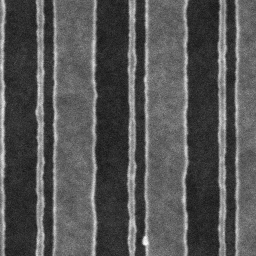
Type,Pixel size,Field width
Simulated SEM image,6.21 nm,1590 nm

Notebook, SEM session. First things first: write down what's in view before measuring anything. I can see lines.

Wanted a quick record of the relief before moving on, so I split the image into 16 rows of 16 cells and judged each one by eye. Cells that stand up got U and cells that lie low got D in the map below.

DDUUUUDDUUUUDDUU
DDUUUUDDUUUUDDUU
DDUUUUDDUUUUDDUU
DDUUUUDDUUUUDDUU
DDUUUUDDUUUUDDUU
DDUUUUDDUUUUDDUU
DDUUUUDDUUUUDDUU
DDUUUUDDUUUUDDUU
DDUUUUDDUUUUDDUU
DDUUUUDDUUUUDDUU
DDUUUUDDUUUUDDUU
DDUUUUDDUUUUDDUU
DDUUUUDDUUUUDDUU
DDUUUUDDUUUUDDUU
DDUUUUDDUUUUDDUU
DDUUUUDDUUUUDDUU